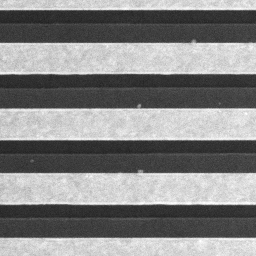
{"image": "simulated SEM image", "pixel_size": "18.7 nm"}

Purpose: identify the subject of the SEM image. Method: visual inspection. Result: lines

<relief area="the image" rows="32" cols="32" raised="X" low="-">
XXXXXXXXXXXXXXXXXXXXXXXXXXXXXXXX
--------------------------------
--------------------------------
--------------------------------
--------------------------------
XXXXXXXXXXXXXXXXXXXXXXXXXXXXXXXX
XXXXXXXXXXXXXXXXXXXXXXXXXXXXXXXX
XXXXXXXXXXXXXXXXXXXXXXXXXXXXXXXX
XXXXXXXXXXXXXXXXXXXXXXXXXXXXXXXX
--------------------------------
--------------------------------
--------------------------------
--------------------------------
--------------------------------
XXXXXXXXXXXXXXXXXXXXXXXXXXXXXXXX
XXXXXXXXXXXXXXXXXXXXXXXXXXXXXXXX
XXXXXXXXXXXXXXXXXXXXXXXXXXXXXXXX
--------------------------------
--------------------------------
--------------------------------
--------------------------------
--------------------------------
XXXXXXXXXXXXXXXXXXXXXXXXXXXXXXXX
XXXXXXXXXXXXXXXXXXXXXXXXXXXXXXXX
XXXXXXXXXXXXXXXXXXXXXXXXXXXXXXXX
XXXX----XXXXXXXXXXX-XXXXXXXXXXXX
--------------------------------
--------------------------------
--------------------------------
--------------------------------
XXXXXXXXXXXXXXXXXXXXXXXXXXXXXXXX
XXXXXXXXXXXXXXXXXXXXXXXXXXXXXXXX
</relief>